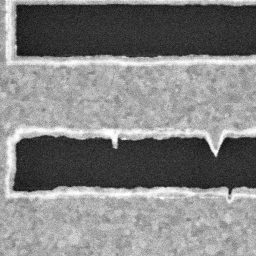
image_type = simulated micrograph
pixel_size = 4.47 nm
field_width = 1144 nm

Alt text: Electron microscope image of one or a few lines or trenches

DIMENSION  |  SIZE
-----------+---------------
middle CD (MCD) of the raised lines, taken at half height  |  315 nm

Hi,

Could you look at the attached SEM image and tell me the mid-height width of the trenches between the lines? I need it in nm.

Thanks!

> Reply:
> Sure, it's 274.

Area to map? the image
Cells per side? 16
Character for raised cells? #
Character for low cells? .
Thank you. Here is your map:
#...............
#...............
#...............
#...............
################
################
################
################
#............#..
#...............
#...............
................
################
################
################
################